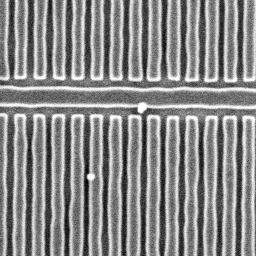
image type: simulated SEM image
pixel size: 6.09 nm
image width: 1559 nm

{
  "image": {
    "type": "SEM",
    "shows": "groups of lines, slits or small figures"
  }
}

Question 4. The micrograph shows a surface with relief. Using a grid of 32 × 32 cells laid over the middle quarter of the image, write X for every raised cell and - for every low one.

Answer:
--XXX--XXX--XX--XXX--XXX--XXX--X
--XXX--XX---XX--XXX--XXX--XXX--X
--XXX--XX---XX--XXX--XXX--XXX--X
--XX---XX---XX--XXX--XXX--XXX--X
--------------------------------
--------------------------------
XXXXXXXXXXXXXXXXXXXXXXXXXXXXXXXX
XXXXXXXXXXXXXXXXXXXXXXXXXXXXXXXX
XXXXXXXXXXXXXXXXXXXXXXXXXXXXXXXX
XXXXXXXXXXXXXXXXXXXXXXXXXXXXXXXX
----------X----XXXXXXXXXXXXXXXXX
-------------------X------------
--------------------------------
--XXX--XX---XX--XXX--XXX--XX---X
--XXX--XX---XX--XXX--XXX--XX---X
--XXX--XX---XX--XXX--XXX--XX---X
--XX---XX---XX--XXX--XXX--XX---X
--XX---XX--XXX--XXX--XXX--XXX--X
--XX---XX--XXX--XXX--XXX--XXX--X
--XX---XX--XXX--XXX--XXX--XXX--X
--XX---XX---XX--XXX--XXX--XX---X
--XX---XX---XX--XXX--XXX--XX---X
--XX---XX---XX--XXX--XXX--XXX--X
--XXX--XX---XX--XXX--XXX--XXX-XX
--XXX--XX---XX--XXX--XXX--XXX-XX
--XXX--XX---XX--XXX--XXX--XX---X
--XXX--XX---XX--XXX--XXX--XX---X
--XXX-XXX---XX--XXX--XXX--XX---X
--XXX-XXX---XX--XXX--XXX--XX---X
--XXX-XXX--XXX--XXX--XXX--XX---X
--XXX-XXX--XXX--XXX--XXX--XX---X
--XXX-XXX--XXX--XXX--XXX-XXX---X